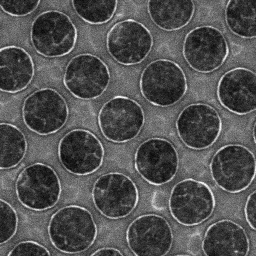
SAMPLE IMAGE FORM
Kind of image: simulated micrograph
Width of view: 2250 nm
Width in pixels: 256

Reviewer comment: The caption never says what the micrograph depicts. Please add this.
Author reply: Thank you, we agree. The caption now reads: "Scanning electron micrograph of a regular array of raised bodies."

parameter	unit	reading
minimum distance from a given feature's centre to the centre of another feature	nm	476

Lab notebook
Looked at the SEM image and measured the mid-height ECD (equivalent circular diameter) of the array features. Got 398 nm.